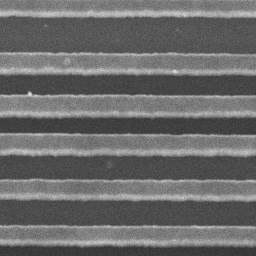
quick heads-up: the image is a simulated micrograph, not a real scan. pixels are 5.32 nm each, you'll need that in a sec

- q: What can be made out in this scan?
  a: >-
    lines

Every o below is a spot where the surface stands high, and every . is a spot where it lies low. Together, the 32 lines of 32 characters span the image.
oooooooooooooooooooooooooooooooo
oooooooooooooooooooooooooooooooo
................................
................................
................................
................................
................................
oooooooooooooooooooooooooooooooo
oooooooooooooooooooooooooooooooo
................................
................................
................................
oooooooooooooooooooooooooooooooo
oooooooooooooooooooooooooooooooo
oooooooooooooooooooooooooooooooo
................................
................................
oooooooooooooooooooooooooooooooo
oooooooooooooooooooooooooooooooo
................................
................................
................................
...ooo..o.........o.............
oooooooooooooooooooooooooooooooo
oooooooooooooooooooooooooooooooo
................................
................................
................................
oooooooooooooooooooooooooooooooo
oooooooooooooooooooooooooooooooo
oooooooooooooooooooooooooooooooo
................................